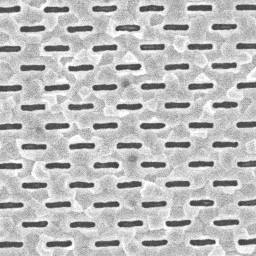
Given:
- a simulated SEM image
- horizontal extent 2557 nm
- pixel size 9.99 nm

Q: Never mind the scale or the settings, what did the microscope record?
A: a regular array of holes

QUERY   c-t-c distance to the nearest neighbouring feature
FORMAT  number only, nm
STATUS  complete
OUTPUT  303